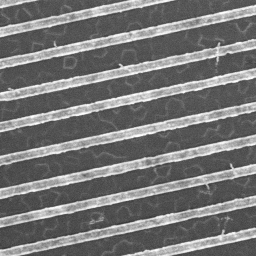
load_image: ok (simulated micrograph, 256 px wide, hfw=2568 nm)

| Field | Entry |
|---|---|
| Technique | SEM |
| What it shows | parallel lines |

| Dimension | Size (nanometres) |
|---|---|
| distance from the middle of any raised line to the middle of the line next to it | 312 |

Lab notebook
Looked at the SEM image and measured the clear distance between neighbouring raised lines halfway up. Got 238 nm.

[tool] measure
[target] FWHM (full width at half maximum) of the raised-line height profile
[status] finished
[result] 76.1 nm